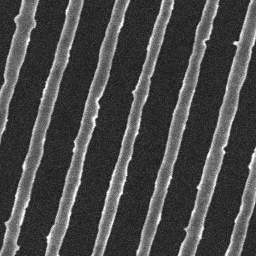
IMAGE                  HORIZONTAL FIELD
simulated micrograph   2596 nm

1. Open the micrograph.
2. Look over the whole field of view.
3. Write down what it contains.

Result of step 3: parallel lines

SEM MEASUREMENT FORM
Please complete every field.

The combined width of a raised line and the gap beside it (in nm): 444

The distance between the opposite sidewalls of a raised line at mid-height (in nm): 133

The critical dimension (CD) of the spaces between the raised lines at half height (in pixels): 30.5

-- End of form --